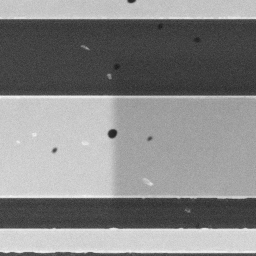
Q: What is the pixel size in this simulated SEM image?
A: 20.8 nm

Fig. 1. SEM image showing lines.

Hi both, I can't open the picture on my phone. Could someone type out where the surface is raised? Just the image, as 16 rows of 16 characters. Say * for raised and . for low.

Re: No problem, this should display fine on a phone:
****************
................
................
................
................
................
****************
****************
****************
****************
****************
****************
................
................
****************
****************